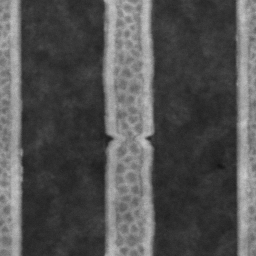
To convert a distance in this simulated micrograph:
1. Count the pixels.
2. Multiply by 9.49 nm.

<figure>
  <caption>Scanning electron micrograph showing one or a few lines or trenches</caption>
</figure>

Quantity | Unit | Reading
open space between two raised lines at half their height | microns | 0.91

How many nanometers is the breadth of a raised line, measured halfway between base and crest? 343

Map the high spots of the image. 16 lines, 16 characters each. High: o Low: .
o......oo......o
o......oo......o
o......oo......o
o......oo......o
o......oo......o
o......oo......o
o......oo......o
o......oo......o
o......oo......o
o......oo......o
o......oo......o
o......oo......o
o......oo......o
o......oo......o
o......oo......o
o......oo......o